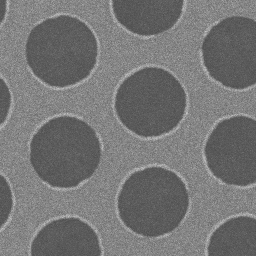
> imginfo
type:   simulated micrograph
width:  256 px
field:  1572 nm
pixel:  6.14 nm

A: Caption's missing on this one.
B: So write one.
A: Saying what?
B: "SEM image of holes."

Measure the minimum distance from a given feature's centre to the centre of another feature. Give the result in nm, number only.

610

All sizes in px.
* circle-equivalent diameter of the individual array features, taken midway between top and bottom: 70.4